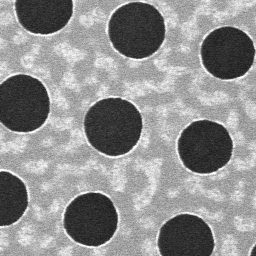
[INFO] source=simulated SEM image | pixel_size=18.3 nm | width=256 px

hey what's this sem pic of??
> holes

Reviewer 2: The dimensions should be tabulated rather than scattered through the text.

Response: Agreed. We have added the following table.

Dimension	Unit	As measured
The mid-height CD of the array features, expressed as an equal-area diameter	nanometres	1030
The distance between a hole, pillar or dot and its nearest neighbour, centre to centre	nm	1730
